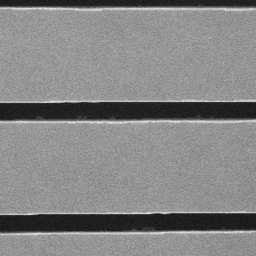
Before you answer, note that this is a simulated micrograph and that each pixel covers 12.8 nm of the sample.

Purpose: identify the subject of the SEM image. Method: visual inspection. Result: lines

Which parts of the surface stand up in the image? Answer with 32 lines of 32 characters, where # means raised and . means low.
................................
################################
################################
################################
################################
################################
################################
################################
################################
################################
################################
################################
################################
................................
................................
################################
################################
################################
################################
################################
################################
################################
################################
################################
################################
################################
################################
................................
................................
################################
################################
################################